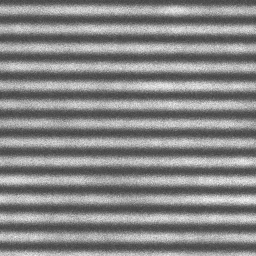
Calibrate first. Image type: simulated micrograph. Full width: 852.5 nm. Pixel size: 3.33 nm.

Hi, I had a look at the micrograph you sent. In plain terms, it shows parallel lines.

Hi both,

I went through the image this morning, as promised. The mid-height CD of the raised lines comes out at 9.82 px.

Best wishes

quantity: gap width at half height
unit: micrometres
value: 0.0324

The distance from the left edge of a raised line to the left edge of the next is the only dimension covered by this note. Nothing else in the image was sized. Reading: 0.0629 µm